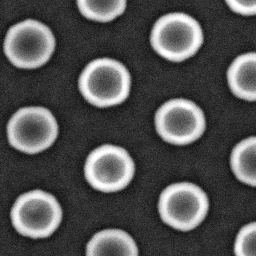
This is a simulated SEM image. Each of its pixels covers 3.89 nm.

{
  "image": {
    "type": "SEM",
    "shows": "a regular array of raised bodies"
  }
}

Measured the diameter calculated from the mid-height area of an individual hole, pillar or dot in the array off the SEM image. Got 176 nm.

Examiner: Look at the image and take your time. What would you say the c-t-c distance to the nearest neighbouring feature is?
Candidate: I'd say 329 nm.